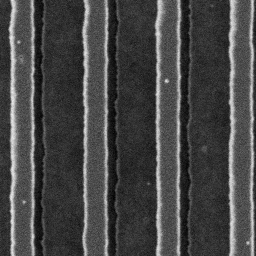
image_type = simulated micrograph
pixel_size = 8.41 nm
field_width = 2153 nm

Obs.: lines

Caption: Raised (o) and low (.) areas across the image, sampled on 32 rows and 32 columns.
.ooo.......oo.......oo.......ooo
..oo.......oo.......ooo......ooo
.ooo.......oo.......ooo......ooo
.ooo......ooo......ooo.......oo.
.ooo......ooo......ooo.......oo.
.ooo.......oo.......ooo......oo.
.ooo.......oo.......oo.......ooo
.ooo.......oo.......oo.......ooo
.ooo.......oo.......oo.......oo.
.ooo.......oo.......ooo......oo.
.ooo.......oo.......oo.......oo.
.ooo.......oo.......ooo......oo.
.ooo.......oo.......oo.......oo.
.ooo.......oo.......oo.......oo.
.ooo.......oo.......oo.......ooo
.ooo.......oo.......oo.......oo.
.ooo.......oo.......oo.......ooo
.ooo.......oo.......oo.......ooo
.ooo.......oo.......oo.......ooo
.ooo.......oo.......oo.......ooo
..oo.......oo.......oo.......ooo
.ooo.......oo.......oo.......ooo
..oo.......oo.......oo.......ooo
.ooo.......oo.......oo.......oo.
.ooo.......oo.......oo.......oo.
.ooo.......oo.......oo.......ooo
.ooo.......oo.......oo.......ooo
.ooo.......oo.......oo.......ooo
.ooo.......oo.......oo.......ooo
.ooo......ooo.......oo.......ooo
.ooo......ooo.......oo.......ooo
.ooo.......oo.......oo.......ooo